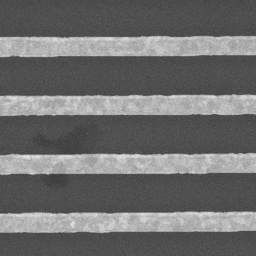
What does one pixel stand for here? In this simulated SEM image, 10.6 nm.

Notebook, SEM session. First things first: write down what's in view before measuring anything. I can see lines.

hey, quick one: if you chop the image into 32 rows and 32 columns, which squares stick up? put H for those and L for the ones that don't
LLLLLLLLLLLLLLLLLLLLLLLLLLLLLLLL
LLLLLLLLLLLLLLLLLLLLLLLLLLLLLLLL
LLLLLLLLLLLLLLLLLLLLLLLLLLLLLLLL
LLLLLLLLLLLLLLLLLLLLLLLLLLLLLLLL
LLLLLLLLLLLLLLLLLLLLLLLLLLLLLLLL
HHHHHHHHHHHHHHHHHHHHHHHHHHHHHHHH
HHHHHHHHHHHHHHHHHHHHHHHHHHHHHHHH
LLLLLLLLLLLLLLLLLLLLLLLLLLLLLLLL
LLLLLLLLLLLLLLLLLLLLLLLLLLLLLLLL
LLLLLLLLLLLLLLLLLLLLLLLLLLLLLLLL
LLLLLLLLLLLLLLLLLLLLLLLLLLLLLLLL
LLLLLLLLLLLLLLLLLLLLLLLLLLLLLLLL
HHHHHHHHHHHHHHHHHHHHHHHHHHHHHHHH
HHHHHHHHHHHHHHHHHHHHHHHHHHHHHHHH
LLLLLLLLLLLLLLLLLLLLLLLLLLLLLLLL
LLLLLLLLLLLLLLLLLLLLLLLLLLLLLLLL
LLLLLLLLLLLLLLLLLLLLLLLLLLLLLLLL
LLLLLLLLLLLLLLLLLLLLLLLLLLLLLLLL
LLLLLLLLLLLLLLLLLLLLLLLLLLLLLLLL
HHHHLHHLHHHHHHHHHHHHHHHHHHHHHHHH
HHHHHHHHHHHHHHHHHHHHHHHHHHHHHHHH
HHHHHHHHHHHHHHHHHHHHHHHHHHHHHHHH
LLLLLLLLLLLLLLLLLLLLLLLLLLLLLLLL
LLLLLLLLLLLLLLLLLLLLLLLLLLLLLLLL
LLLLLLLLLLLLLLLLLLLLLLLLLLLLLLLL
LLLLLLLLLLLLLLLLLLLLLLLLLLLLLLLL
LLLLLLLLLLLLLLLLLLLLLLLLLLLLLLLL
HHHHHHHHHHHHHHHHHHHHHHHHHHHHHHHH
HHHHHHHHHHHHHHHHHHHHHHHHHHHHHHHH
LLLLLLLLLLLLLLLLLLLLLLLLLLLLLLLL
LLLLLLLLLLLLLLLLLLLLLLLLLLLLLLLL
LLLLLLLLLLLLLLLLLLLLLLLLLLLLLLLL